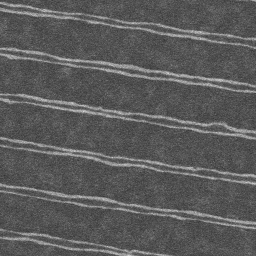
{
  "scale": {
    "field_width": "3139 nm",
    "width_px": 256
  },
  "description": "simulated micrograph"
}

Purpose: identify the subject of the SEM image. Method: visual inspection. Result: parallel lines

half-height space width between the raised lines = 0.464 µm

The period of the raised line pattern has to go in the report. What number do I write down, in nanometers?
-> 552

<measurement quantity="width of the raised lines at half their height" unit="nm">84.9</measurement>